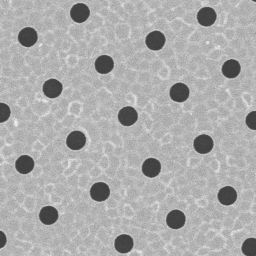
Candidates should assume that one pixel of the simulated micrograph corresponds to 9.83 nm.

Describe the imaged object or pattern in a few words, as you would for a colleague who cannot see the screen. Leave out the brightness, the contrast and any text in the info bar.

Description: a regular array of holes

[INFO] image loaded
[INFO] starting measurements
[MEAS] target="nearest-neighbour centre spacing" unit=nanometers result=558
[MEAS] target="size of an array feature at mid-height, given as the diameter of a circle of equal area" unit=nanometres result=193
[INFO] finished